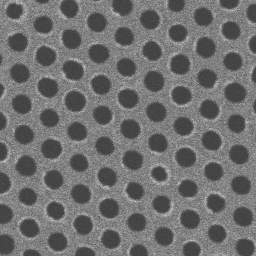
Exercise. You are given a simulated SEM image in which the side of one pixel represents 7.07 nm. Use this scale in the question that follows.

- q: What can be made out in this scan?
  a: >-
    a regular array of holes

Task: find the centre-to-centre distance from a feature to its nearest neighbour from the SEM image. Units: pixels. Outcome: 30.5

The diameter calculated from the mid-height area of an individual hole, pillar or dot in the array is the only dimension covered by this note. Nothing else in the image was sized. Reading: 133 nm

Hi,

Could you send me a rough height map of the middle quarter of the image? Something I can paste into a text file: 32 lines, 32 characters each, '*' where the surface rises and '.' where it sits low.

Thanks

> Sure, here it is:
.....********.....*********....*
.....********.....*********....*
.....*********...****...****..**
*...***....*********.....*******
*******....*********.....*******
*******.....********.....*******
*******....****..****...***....*
*...*****.****....*********.....
.....********......********.....
.....*********....**********...*
*....****.*****...***....*******
*...****....*********....*******
*******.....*********.....******
********....*********....****..*
********...****...**********....
*....*********.....********.....
*.....********.....*********....
*.....*********....****.*****..*
**...****..*****..***....*******
********....*********.....******
********....*********.....******
********....**********...****...
***.*****..****....*********....
**...**********.....********....
**....*********.....********....
**....*********....**********..*
***..****...**********...*******
********.....*********....******
********.....*********....******
*********....****************...
***..******.****...**********...
**....*********.....*********...